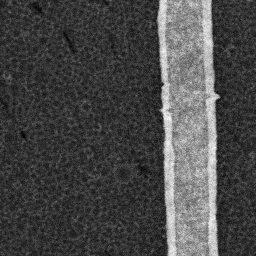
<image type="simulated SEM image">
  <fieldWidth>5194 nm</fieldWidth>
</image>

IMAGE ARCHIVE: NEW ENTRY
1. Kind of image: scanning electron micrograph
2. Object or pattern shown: one or a few lines or trenches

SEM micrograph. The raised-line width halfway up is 863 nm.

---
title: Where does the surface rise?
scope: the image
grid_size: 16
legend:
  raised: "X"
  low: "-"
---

----------XXX---
----------XXX---
----------XXX---
----------XXX---
----------XXX---
----------XXX---
----------XXX---
----------XXX---
-----------XX---
-----------XX---
-----------XX---
-----------XX---
-----------XX---
-----------XX---
-----------XX---
-----------XX---